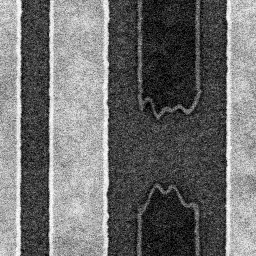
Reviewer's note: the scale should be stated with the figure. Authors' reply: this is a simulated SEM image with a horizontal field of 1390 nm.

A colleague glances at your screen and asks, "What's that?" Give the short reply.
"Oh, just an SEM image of one or a few lines or trenches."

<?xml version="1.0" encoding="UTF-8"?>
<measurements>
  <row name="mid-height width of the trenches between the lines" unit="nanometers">179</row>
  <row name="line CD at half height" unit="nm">296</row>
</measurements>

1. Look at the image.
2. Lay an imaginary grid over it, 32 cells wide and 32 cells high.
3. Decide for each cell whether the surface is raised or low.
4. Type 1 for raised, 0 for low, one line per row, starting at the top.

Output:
11000011111110000011111110000111
11000011111110000111111110000111
11000011111110000111111110000111
11000011111110000111111110000111
11000011111110000111111110000111
11000011111110000111111110000111
11000011111110000111111110001111
11000001111110000111111110000111
11000011111110000111111110000111
11000001111110000111111110001111
11000001111110000011111110000111
11000011111110000011111110000111
11000001111110000011111110000111
11000001111110000001110100000111
11000011111110000000000000000111
11000001111110000000000000000111
11000011111110000000000000000111
11000011111110000000000000000111
11000011111110000000000000000111
11000011111110000000000000000111
11000011111110000000000000000111
11000011111110000000000000000111
11000011111110000000000000000111
11000011111110000001000000000111
11000011111110000001110000000111
11000011111110000011111000000111
11000011111110000011111110000111
11000011111110000111111110000111
11000011111110000011111110000111
11000011111110000111111110000111
11000011111110000111111110000111
11000011111110000011111110001111